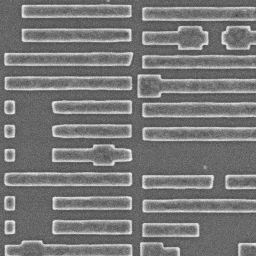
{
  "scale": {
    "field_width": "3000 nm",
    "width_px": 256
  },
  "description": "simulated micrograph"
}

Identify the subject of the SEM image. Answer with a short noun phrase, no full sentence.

wiring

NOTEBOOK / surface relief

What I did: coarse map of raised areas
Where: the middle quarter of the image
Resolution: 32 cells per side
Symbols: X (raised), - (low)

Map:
--------------------XXXXXXXXXXXX
--------------------------------
--------------------------------
XXXXXXXXXXXXXXXXX--XXXXX--------
XXXXXXXXXXXXXXXXX--XXXXXXXXXXXXX
XXXXXXXXXXXXXXXXX--XXXXXXXXXXXXX
-------------------XXXXXXXXXXXXX
-------------------XXXXX--------
--------------------------------
XXXXXXXXXXXXXXXXX---------------
XXXXXXXXXXXXXXXXX---XXXXXXXXXXXX
XXXXXXXXXXXXXXXXX---XXXXXXXXXXXX
--------------------XXXXXXXXXXXX
--------------------------------
--------------------------------
XXXXXXXXXXXXXXXXX---------------
XXXXXXXXXXXXXXXXX---XXXXXXXXXXXX
XXXXXXXXXXXXXXXXX---XXXXXXXXXXXX
--------------------XXXXXXXXXXXX
--------------------------------
--------XXXX--------------------
XXXXXXXXXXXXXXXX----------------
XXXXXXXXXXXXXXXXX---------------
XXXXXXXXXXXXXXXXX---------------
-------XXXXXX-------------------
--------------------------------
--------------------------------
XXXXXXXXXXXXXXXXX---------------
XXXXXXXXXXXXXXXXX---XXXXXXXXXXXX
XXXXXXXXXXXXXXXXX---XXXXXXXXXXXX
--------------------XXXXXXXXXXXX
--------------------------------